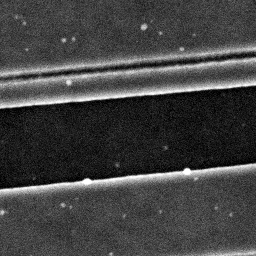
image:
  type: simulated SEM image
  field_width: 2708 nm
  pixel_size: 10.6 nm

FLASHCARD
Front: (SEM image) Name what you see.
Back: lines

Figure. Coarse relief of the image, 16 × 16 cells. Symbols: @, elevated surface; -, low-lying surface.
@@@@@@@@@@@@@@@@
@@@@@@@@@@@@@@@@
@@@@@@@@@@@@@@@@
@@@@@@@@@@@@@@@@
@@@@@@@@@@@@@@@@
@@@@@@@@@@@@@@--
@@@-------------
----------------
----------------
----------------
--------------@@
----@@@@@@@@@@@@
@@@@@@@@@@@@@@@@
@@@@@@@@@@@@@@@@
@@@@@@@@@@@@@@@@
@@@@@@@@@@@@@@@@